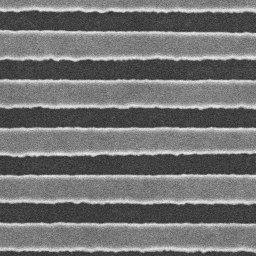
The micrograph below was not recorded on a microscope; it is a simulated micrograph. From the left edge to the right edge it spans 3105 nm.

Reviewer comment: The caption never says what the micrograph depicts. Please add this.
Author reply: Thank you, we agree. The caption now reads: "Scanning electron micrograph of lines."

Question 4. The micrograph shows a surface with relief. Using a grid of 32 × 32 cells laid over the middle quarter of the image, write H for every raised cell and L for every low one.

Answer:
LLLLLLLLLLLLLLLLLLLLLLLLLLLLLLLL
LLLLLLLLLLLLLLLLLLLLLLLLLLLLLLLL
LLLLLLLLLLLLLLLLLLLLLLLLLLLLLLLL
LLLLLLLLLLLLLLLLLLLLLLLLLLLLLLLL
HHHHHHHHHHHHHHHHHHHHHHHHHHHHHHHH
HHHHHHHHHHHHHHHHHHHHHHHHHHHHHHHH
HHHHHHHHHHHHHHHHHHHHHHHHHHHHHHHH
HHHHHHHHHHHHHHHHHHHHHHHHHHHHHHHH
HHHHHHHHHHHHHHHHHHHHHHHHHHHHHHHH
HHHHHHHHHHHHHHHHHHHHHHHHHHHHHHHH
HHHHHHHHHHHHHHHHHHHHHHHHHHHHHHHH
LLLLLLLLLLLLLLLLLLLLLLLLLLLLLLLL
LLLLLLLLLLLLLLLLLLLLLLLLLLLLLLLL
LLLLLLLLLLLLLLLLLLLLLLLLLLLLLLLL
LLLLLLLLLLLLLLLLLLLLLLLLLLLLLLLL
LLLLLLLLLLLLLLLLLLLLLLLLLLLLLLLL
HHHHHHHHHHHHHHHHHHHHHHHHHHHHHHHH
HHHHHHHHHHHHHHHHHHHHHHHHHHHHHHHH
HHHHHHHHHHHHHHHHHHHHHHHHHHHHHHHH
HHHHHHHHHHHHHHHHHHHHHHHHHHHHHHHH
HHHHHHHHHHHHHHHHHHHHHHHHHHHHHHHH
HHHHHHHHHHHHHHHHHHHHHHHHHHHHHHHH
HHHHHHHHHLLHHHHHLHHLLHHLLLLHHLHL
LLLLLLLLLLLLLLLLLLLLLLLLLLLLLLLL
LLLLLLLLLLLLLLLLLLLLLLLLLLLLLLLL
LLLLLLLLLLLLLLLLLLLLLLLLLLLLLLLL
LLLLLLLLLLLLLLLLLLLLLLLLLLLLLLLL
LLLLLLLLLLLLLLLLLLLLLLLLLLLLLLLL
HHHHHHHHHHHHHHHHHHHHHHHHHHHHHHHH
HHHHHHHHHHHHHHHHHHHHHHHHHHHHHHHH
HHHHHHHHHHHHHHHHHHHHHHHHHHHHHHHH
HHHHHHHHHHHHHHHHHHHHHHHHHHHHHHHH